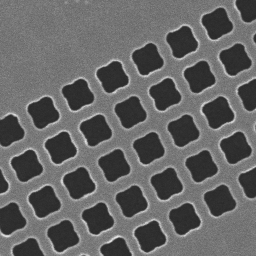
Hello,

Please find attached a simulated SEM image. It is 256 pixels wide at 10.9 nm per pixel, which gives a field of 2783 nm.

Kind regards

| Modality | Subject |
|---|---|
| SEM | a regular array of holes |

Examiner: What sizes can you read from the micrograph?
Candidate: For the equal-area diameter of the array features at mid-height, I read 321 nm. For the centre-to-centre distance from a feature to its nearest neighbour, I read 423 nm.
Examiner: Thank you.